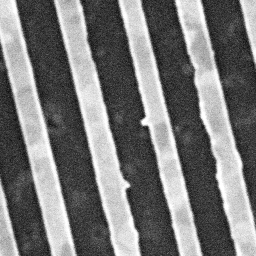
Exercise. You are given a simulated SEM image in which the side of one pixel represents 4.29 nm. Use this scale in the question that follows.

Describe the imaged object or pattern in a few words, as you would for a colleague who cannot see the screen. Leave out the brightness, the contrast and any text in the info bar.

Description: one or a few lines or trenches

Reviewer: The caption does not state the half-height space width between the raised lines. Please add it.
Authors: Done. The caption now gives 172 nanometres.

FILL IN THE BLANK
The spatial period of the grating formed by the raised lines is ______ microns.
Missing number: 0.258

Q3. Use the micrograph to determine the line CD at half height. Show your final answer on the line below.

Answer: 91.7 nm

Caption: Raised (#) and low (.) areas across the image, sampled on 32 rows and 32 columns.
##.....###.....###....###.....##
##.....###.....###....###.....##
##.....####.....##.....##......#
###.....###.....##.....###.....#
###.....###.....##.....###.....#
###.....###.....###....###.....#
###.....###.....###.....###.....
.###.....###.....##.....###.....
.###.....###.....##.....###.....
.###.....###.....###....###.....
.###.....###.....###.....##.....
..##......###.....##.....###....
..###.....###.....##.....###....
..###.....###.....###....###....
..###......##.....###....###....
...##......##.....###.....###...
...###.....###.....##.....###...
...###.....###.....###....###...
...###.....###.....###.....##...
....##......##......##.....###..
....###.....###.....##.....###..
....###.....###.....###....###..
....###.....###.....###....###..
.....##.....####.....##.....###.
.....###.....###.....##.....###.
#....###.....###.....###....###.
#....###.....###.....###....###.
#.....##......##......##.....##.
#.....###.....###.....##.....###
##....###.....###.....###....###
##....###.....###.....###....###
##.....##.....###......##.....##